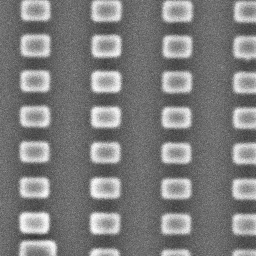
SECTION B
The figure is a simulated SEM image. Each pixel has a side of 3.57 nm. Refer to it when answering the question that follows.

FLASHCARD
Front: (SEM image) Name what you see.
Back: wiring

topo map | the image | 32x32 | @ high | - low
---@@@------@@@------@@@------@@
---@@@------@@@-----@@@@-----@@@
------------@@@------@@@------@@
--------------------------------
---@@@--------------------------
---@@@------@@@-----@@@@-----@@@
---@@@------@@@-----@@@@-----@@@
--------------------------------
--------------------------------
---@@@------@@@-----@@@@-----@@@
---@@@------@@@-----@@@@-----@@@
--------------------------------
--------------------------------
---@@@--------------------------
---@@@------@@@-----@@@@-----@@@
---@@@------@@@-----@@@@-----@@@
--------------------------------
--------------------------------
---@@@------@@@-----@@@@-----@@@
---@@@------@@@-----@@@@-----@@@
--------------------------------
--------------------------------
---@@@------@@------------------
---@@@------@@@-----@@@@-----@@@
---@@@------@@@------@@@-----@@@
--------------------------------
--------------------------------
---@@@------@@@-----@@@@-----@@@
---@@@------@@@-----@@@@-----@@@
--------------------------------
---@@@@-------------------------
---@@@@-----@@@------@@------@@@